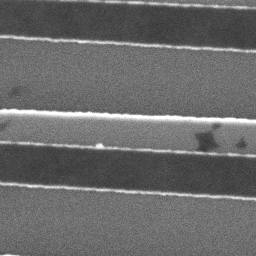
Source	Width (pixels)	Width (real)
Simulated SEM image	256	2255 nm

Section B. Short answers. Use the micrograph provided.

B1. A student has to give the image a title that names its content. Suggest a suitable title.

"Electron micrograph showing lines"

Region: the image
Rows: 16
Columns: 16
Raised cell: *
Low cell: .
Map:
****************
****************
...*************
................
................
................
................
................
................
************....
****************
****************
................
................
................
................